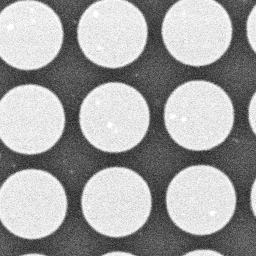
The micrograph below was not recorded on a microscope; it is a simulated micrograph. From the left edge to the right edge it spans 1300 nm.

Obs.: an array of small figures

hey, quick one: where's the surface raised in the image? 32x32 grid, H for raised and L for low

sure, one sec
LLHHHLLLLLLLHHHHLLLLLLHHHHHLLLLL
HHHHHHHLLLLHHHHHHLLLLHHHHHHHLLLH
HHHHHHHLLLHHHHHHHHLLLHHHHHHHHLLH
HHHHHHHHLLHHHHHHHHLLHHHHHHHHHLLH
HHHHHHHHLLHHHHHHHHLLHHHHHHHHHLLH
HHHHHHHHLLHHHHHHHHLLLHHHHHHHHLLH
HHHHHHHLLLHHHHHHHHLLLHHHHHHHLLLL
LHHHHHLLLLLHHHHHHLLLLLHHHHHLLLLL
LLHHHLLLLLLLLLLLLLLLLLLLLLLLLLLL
LLLLLLLLLLLLLLLLLLLLLLLLLLLLLLLL
LLLLLLLLLLLLLHHLLLLLLLLHHHHLLLLL
LHHHHHLLLLLHHHHHHLLLLLHHHHHHLLLL
HHHHHHHLLLLHHHHHHHLLLHHHHHHHHLLH
HHHHHHHHLLHHHHHHHHLLLHHHHHHHHLLH
HHHHHHHHLLHHHHHHHHHLLHHHHHHHHLLH
HHHHHHHHLLHHHHHHHHHLLHHHHHHHHLLH
HHHHHHHHLLHHHHHHHHLLLHHHHHHHHLLL
HHHHHHHLLLLHHHHHHHLLLLHHHHHHLLLL
LHHHHHLLLLLLHHHHLLLLLLLHHHLLLLLL
LLLLLLLLLLLLLLLLLLLLLLLLLLLLLLLL
LLLLLLLLLLLLLLLLLLLLLLLLLLLLLLLL
LLHHHHLLLLLLHHHHHLLLLLLHHHHHLLLL
LHHHHHHLLLLHHHHHHHLLLLHHHHHHHLLL
HHHHHHHHLLLHHHHHHHHLLHHHHHHHHLLL
HHHHHHHHLLHHHHHHHHHLLHHHHHHHHLLH
HHHHHHHHLLHHHHHHHHHLLHHHHHHHHLLH
HHHHHHHHLLHHHHHHHHHLLHHHHHHHHLLL
HHHHHHHHLLLHHHHHHHLLLLHHHHHHHLLL
LHHHHHHLLLLLHHHHHLLLLLLHHHHHLLLL
LLHHHHLLLLLLLLHLLLLLLLLLLLLLLLLL
LLLLLLLLLLLLLLLLLLLLLLLLLLLLLLLL
LLLLLLLLLLLLLLLLLLLLLLLLHHHLLLLL